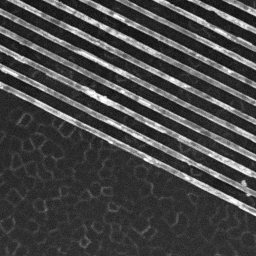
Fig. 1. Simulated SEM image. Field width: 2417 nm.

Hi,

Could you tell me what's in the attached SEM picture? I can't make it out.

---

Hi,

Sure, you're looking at parallel lines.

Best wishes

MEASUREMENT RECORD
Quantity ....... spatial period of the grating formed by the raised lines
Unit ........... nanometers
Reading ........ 153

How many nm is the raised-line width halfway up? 49.7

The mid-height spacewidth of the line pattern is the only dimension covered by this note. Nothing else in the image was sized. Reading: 109 nanometers